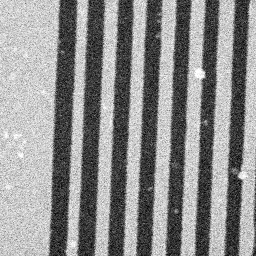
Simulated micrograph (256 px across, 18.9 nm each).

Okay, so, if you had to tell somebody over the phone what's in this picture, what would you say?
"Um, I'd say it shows parallel lines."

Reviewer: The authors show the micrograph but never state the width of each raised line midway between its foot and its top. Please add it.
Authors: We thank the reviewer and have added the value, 232 nanometers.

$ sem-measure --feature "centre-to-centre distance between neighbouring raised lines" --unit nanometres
546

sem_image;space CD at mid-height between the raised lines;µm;0.312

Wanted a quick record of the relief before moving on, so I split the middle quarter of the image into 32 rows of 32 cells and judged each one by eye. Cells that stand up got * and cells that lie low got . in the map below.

...**.....***....***....***....*
...**.....***....***....***....*
...**.....**.....***....***....*
...**.....**.....***....***....*
...**.....**.....***....***....*
...**.....**.....***....***....*
...**....***.....***....***....*
...**....***.....**.....***....*
...**.....**.....**.....***....*
...**....***.....**.....***....*
..***....***.....**.....***....*
..***....***.....**.....***....*
..***....***.....**.....***....*
..***....***....***.....***....*
..***....***....***.....**.....*
..***....***....***....***.....*
..**.....***....***....***.....*
..**.....***....***....***.....*
..**.....***....***....***.....*
..**.....***....***....***.....*
..**.....***....***....***.....*
..**.....***....***....***.....*
..**.....***....***....***.....*
..**.....***....***....***....**
..**.....***....***....***....**
..**.....***....***....***....**
..**.....***....***....***....**
..**.....***....***....***....**
..**.....***....***....***....**
..**.....**.....***....***....**
..**.....**.....***....***....**
..**.....**.....**.....***....**